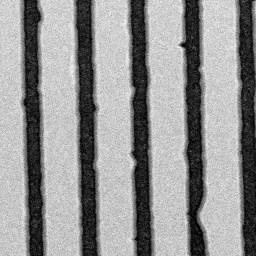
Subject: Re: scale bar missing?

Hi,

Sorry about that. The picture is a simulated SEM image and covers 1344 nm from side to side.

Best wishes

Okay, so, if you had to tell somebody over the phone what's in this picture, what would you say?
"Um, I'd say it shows parallel lines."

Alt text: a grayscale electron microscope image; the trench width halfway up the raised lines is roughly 97.2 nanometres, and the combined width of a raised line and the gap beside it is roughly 282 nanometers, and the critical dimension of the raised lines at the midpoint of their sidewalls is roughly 184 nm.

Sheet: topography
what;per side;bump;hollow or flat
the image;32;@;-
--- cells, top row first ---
@@@--@@@@---@@@@--@@@@@--@@@@@--
@@@--@@@@---@@@@--@@@@@--@@@@@--
@@@--@@@@---@@@@--@@@@@--@@@@@--
@@@--@@@@---@@@@--@@@@@--@@@@@--
@@@--@@@@---@@@@--@@@@@--@@@@@--
@@@--@@@@---@@@@---@@@@--@@@@@--
@@@--@@@@---@@@@---@@@@--@@@@@--
@@@--@@@@---@@@@--@@@@@--@@@@@--
@@@--@@@@@--@@@@---@@@@--@@@@@--
@@@--@@@@@--@@@@---@@@@--@@@@@--
@@@--@@@@@--@@@@---@@@@--@@@@@--
@@@--@@@@@--@@@@@--@@@@--@@@@@--
@@@--@@@@@--@@@@---@@@@--@@@@@--
@@@--@@@@@--@@@@---@@@@--@@@@@--
@@@--@@@@@--@@@@---@@@@--@@@@@--
@@@--@@@@@--@@@@---@@@@--@@@@@--
@@@--@@@@@--@@@@---@@@@--@@@@@--
@@@--@@@@@--@@@@---@@@@--@@@@@--
@@@--@@@@@--@@@@---@@@@---@@@@--
@@@--@@@@@--@@@@---@@@@---@@@@--
@@@--@@@@@--@@@@@--@@@@---@@@@--
@@@--@@@@@--@@@@@--@@@@---@@@@--
@@@--@@@@@--@@@@---@@@@---@@@@--
@@@---@@@@--@@@@@--@@@@---@@@@--
@@@---@@@@--@@@@@--@@@@---@@@@--
@@@---@@@@--@@@@@--@@@@--@@@@@--
@@@---@@@@--@@@@@--@@@@--@@@@@--
@@@---@@@@--@@@@@--@@@@--@@@@@--
@@@---@@@@--@@@@@--@@@@--@@@@@--
@@@---@@@@--@@@@@--@@@@@--@@@@--
@@@---@@@@--@@@@@--@@@@@--@@@@--
@@@---@@@@---@@@@--@@@@@--@@@@--